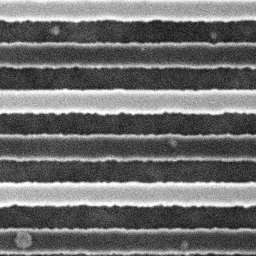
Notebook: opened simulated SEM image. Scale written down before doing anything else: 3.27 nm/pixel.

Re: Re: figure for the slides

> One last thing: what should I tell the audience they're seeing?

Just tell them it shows lines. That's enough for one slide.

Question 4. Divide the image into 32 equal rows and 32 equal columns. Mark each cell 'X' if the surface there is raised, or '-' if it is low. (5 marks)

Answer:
XXXXXXXXXXXXXXXXXXXXXXXXXXXXXXXX
XXXXXXXXXXXXXXXXXXXXXXXXXXXXXXXX
XXXXXXXXXXXXX-XXXXX-XXXXXXXXXXX-
--------------------------------
--------------------------------
XXXXXXXXXX-XXXX-XXXXXXXXXX-XXXXX
XXXXXXXXXXXXXXXXXXXXXXXXXXXXXXXX
XXXXXXXXXXXXXXXXXXXXXXXXXXXXXXXX
--------------------------------
--------------------------------
--------------------------------
XXXXXXXXXXXXXXXXXXXXXXXXXXXXXXXX
XXXXXXXXXXXXXXXXXXXXXXXXXXXXXXXX
XXXXXXXXXXXXXXXXXXXXXXXXXXXXXXXX
--------------------------------
--------------------------------
--------------------------------
XXXXXXXXXXXXXXXXXXXXXXXXXXXXXXXX
XXXXXXXXXXXXXXXXXXXXXXXXXXXXXXXX
XXXXXXXXXXXXXXXXXXXXXXXXXXXXXXXX
--------------------------------
--------------------------------
--------------------------------
XXXXXXXXXXXXXXXXXXXXXXXXXXXXXXXX
XXXXXXXXXXXXXXXXXXXXXXXXXXXXXXXX
XXXXXXXXXXXXXXXXXXXXXXXXXXXXXXXX
--------------------------------
--------------------------------
--------------------------------
XXXXXXXXXXXXXXXXXXXXXXXXXXXXXXXX
XXXXXXXXXXXXXXXXXXXXXXXXXXXXXXXX
XXXXXXXXXXXXXXXXXXXXXXXXXXXXXXXX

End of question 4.